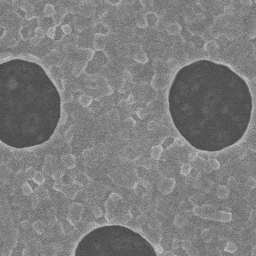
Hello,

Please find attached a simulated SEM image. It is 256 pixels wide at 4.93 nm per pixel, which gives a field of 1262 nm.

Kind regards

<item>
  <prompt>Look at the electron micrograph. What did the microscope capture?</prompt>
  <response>holes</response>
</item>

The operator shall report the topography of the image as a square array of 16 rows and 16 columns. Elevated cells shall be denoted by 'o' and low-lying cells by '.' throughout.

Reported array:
oooooooooooooooo
oooooooooooooooo
oooooooooooooooo
oooooooooooooooo
...oooooooo....o
...oooooooo.....
....ooooooo.....
....ooooooo.....
...oooooooo....o
oooooooooooooooo
oooooooooooooooo
oooooooooooooooo
oooooooooooooooo
oooooooooooooooo
oooooo..oooooooo
ooooo.....oooooo